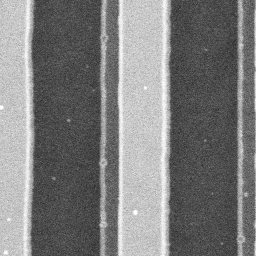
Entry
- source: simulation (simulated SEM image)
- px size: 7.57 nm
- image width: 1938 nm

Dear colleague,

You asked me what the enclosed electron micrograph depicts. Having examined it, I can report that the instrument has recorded lines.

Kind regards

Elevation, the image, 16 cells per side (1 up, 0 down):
1100000111000001
1100000111000001
1100001111000001
1100001111000001
1100000111000001
1100000111000001
1100000111000001
1100000111000001
1100000111000001
1100001111000001
1100001111000001
1100000111000001
1100000111000001
1100001111000001
1100001111000001
1100000111000001